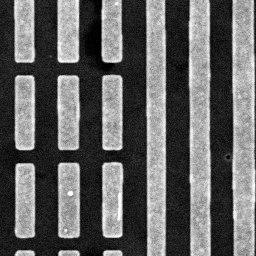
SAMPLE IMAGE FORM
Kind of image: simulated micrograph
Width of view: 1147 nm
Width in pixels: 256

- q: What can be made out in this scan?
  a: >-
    wiring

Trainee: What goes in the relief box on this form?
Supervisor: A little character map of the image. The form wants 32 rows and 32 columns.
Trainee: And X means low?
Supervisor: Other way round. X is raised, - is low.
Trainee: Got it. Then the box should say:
--XX---XXX---XX---XXX---XX---XXX
--XX---XXX---XX---XXX---XX---XXX
--XX---XXX---XX---XXX---XX---XXX
--XX---XXX---XX---XXX---XX---XXX
--XX---XXX---XX---XXX---XX---XXX
--XX---XXX---XX---XXX---XX---XXX
--XX---XXX---XX---XXX---XX---XXX
--XX----XX---XX---XXX---XX---XXX
------------------XXX---XX---XXX
------------------XXX---XX---XXX
--XX---XXX---XX---XXX---XX---XXX
--XX---XXX---XX---XXX---XX---XXX
--XX---XXX---XX---XXX---XX---XXX
--XX---XXX---XX---XXX---XX---XXX
--XX---XXX---XX---XXX---XX---XXX
--XX---XXX---XX---XXX---XX---XXX
--XX---XXX---XX---XXX---XX---XXX
--XX---XXX---XX---XXX---XX---XXX
--XX----XX---XX---XXX---XX---XXX
------------------XXX---XX---XXX
--------X----XX---XXX---XX---XXX
--XX---XXX---XX---XXX---XX---XXX
--XX---XXX---XX---XXX---XX---XXX
--XX---XXX---XX---XXX---XX---XXX
--XX---XXX---XX---XXX---XX---XXX
--XX---XXX---XX---XXX---XX---XXX
--XX---XXX---XX---XXX---XX---XXX
--XX---XXX---XX---XXX---XX---XXX
--XX---XXX---XX---XXX---XX---XXX
--XX----XX---XX---XXX---XX---XXX
------------------XXX---XX---XXX
--XX----XX---XX---XXX---XX---XXX